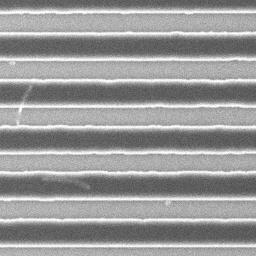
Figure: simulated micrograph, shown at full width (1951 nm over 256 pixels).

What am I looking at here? lines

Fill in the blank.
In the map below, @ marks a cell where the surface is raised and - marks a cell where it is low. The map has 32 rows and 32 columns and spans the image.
@@@@@@@@@@@@@@@@@@@@@@@@@@@@@@@@
@@@@@@@@@@@@@@@@@@@@@@@@@@@@@@@@
--------------------------------
--------------------------------
@@@@@@@@@@@@@@@@@@@@@@@@@@@@@@@@
@@@@@@@@@@@@@@@@@@@@@@@@@@@@@@@@
@@@@@@@@@@@@@@@@@@@@@@@@@@@@@@@@
--------------------------------
--------------------------------
--------------------------------
@@@@@@@@@@@@@@@@@@@@@@@@@@@@@@@@
@@@@@@@@@@@@@@@@@@@@@@@@@@@@@@@@
@@@@@@@@@@@@@@@@@@@@@@@@@@@@@@@@
--------------------------------
--------------------------------
--------------------------------
@@@@@@@@@@@@@@@@@@@@@@@@@@@@@@@@
@@@@@@@@@@@@@@@@@@@@@@@@@@@@@@@@
@@@@@@@@@@@@@@@@@@@@@@@@@@@@@@@@
--------------------------------
--------------------------------
@--@@@@--@@@@@@-@@@@--@@@@@@@@@@
@@@@@@@@@@@@@@@@@@@@@@@@@@@@@@@@
@@@@@@@@@@@@@@@@@@@@@@@@@@@@@@@@
@@@@@@@@@@@@@@@@@@@@@@@@@@@@@@@@
--------------------------------
--------------------------------
@@@@@@@@@@@@@@@@@@@@@@@@@@@@@@@@
@@@@@@@@@@@@@@@@@@@@@@@@@@@@@@@@
@@@@@@@@@@@@@@@@@@@@@@@@@@@@@@@@
@@@@@@@@@@@@@@@@@@@@@@@@@@@@@@@@
--------------------------------